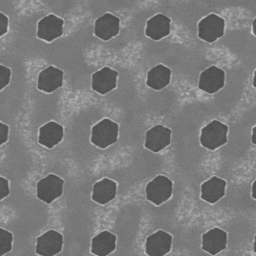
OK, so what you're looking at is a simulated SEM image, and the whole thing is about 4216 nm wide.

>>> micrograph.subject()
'a regular array of holes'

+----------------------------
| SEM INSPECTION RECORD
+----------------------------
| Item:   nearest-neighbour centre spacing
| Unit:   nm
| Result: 856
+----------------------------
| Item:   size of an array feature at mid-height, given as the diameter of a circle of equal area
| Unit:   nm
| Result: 433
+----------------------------